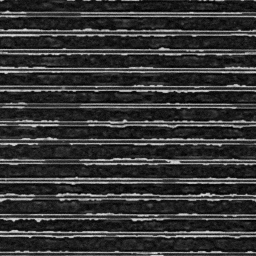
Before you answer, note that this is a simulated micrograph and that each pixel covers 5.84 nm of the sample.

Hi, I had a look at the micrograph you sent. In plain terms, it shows parallel lines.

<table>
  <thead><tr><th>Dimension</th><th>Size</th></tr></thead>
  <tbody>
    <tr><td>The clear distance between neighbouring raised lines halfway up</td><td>75.2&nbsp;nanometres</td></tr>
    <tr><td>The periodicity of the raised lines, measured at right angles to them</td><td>107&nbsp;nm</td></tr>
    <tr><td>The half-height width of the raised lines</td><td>29.2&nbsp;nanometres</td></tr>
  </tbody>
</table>